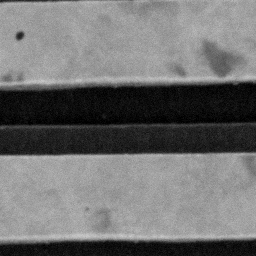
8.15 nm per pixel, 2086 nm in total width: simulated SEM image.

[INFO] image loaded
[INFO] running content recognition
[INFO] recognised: lines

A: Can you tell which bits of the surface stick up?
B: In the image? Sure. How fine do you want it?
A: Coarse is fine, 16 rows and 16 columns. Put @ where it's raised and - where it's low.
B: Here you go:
@@@@@@@@@@@@@@@@
@@@@@@@@@@@@@@@@
@@@@@@@@@@@@@@@@
@@@@@@@@@@@@@@@@
@@@@@@@@@@@@@@@@
----------------
----------------
----------------
----------------
----------------
@@@@@@@@@@@@@@@@
@@@@@@@@@@@@@@@@
@@@@@@@@@@@@@@@@
@@@@@@@@@@@@@@@@
@@@@@@@@@@@@@@@@
----------------